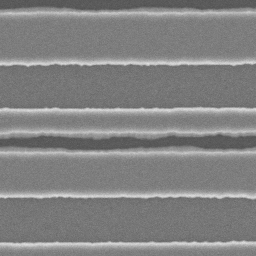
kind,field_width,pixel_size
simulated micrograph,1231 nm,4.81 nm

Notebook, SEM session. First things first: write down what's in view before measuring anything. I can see lines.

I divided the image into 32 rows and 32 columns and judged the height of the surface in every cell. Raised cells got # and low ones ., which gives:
................................
.#########....##################
################################
################################
################################
################################
################################
################################
................................
................................
................................
................................
................................
................................
################################
################################
################################
................................
................................
################################
################################
################################
################################
################################
################################
................................
................................
................................
................................
................................
##..#######.####################
################################